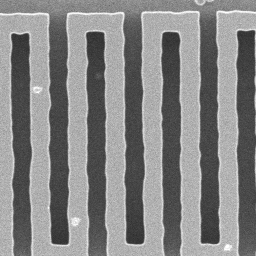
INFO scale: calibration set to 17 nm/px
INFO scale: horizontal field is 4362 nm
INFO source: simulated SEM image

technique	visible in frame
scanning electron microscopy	groups of lines, slits or small figures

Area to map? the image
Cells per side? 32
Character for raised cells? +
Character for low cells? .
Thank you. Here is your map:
................................
.......................++..+++++
++++++..+++++++...+++++++..+++++
++++++..+++++++...+++++++..+++++
+...++..+++..+++..++..+++..+++..
+...++..+++..+++..++..+++..+++..
+...++...++..++...++..+++..+++..
+...++..+++..+++..++...++..+++..
+...++..+++..+++..++...++..+++..
+...++..+++..+++..++...++..+++..
+...++..+++..+++..++...++..+++..
+...++..+++..+++..++..+++..+++..
+...++...++..+++..++..+++..+++..
+...++...++..+++..++...++..+++..
+...++...++..+++..++...++..+++..
+...++..+++..+++..++...++..+++..
++..++..+++..+++..++...++..+++..
++..++..+++..+++..++...++..+++..
++..++...++..+++..++...++..+++..
++..++...++..+++..++...++..+++..
++..++...++..+++..++..+++..+++..
++..++...++..+++..++...++..+++..
++..++...++..+++..++...++..+++..
++..++...++..+++..++...++..+++..
++..++...++..+++..++...++..+++..
++..++..+++..+++..++...++..+++..
++..++..+++..+++..++...++..+++..
++..++..+++..+++..++...++..+++..
++..++...++..+++..+++..++..+++..
++..++...++..+++..++...++..+++..
++..+++.+++..+++..++...+++.+++..
++..+++++++..++++++++..+++++++..